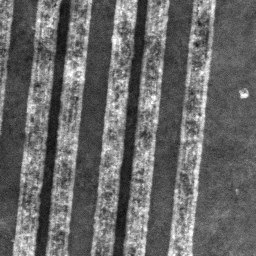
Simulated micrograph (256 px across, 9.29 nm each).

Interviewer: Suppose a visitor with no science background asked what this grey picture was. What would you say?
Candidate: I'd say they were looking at parallel lines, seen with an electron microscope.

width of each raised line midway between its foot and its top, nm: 169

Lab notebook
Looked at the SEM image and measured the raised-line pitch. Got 0.359 microns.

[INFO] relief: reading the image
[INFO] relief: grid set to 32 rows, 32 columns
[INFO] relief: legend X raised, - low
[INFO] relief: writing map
XX---XX--XX----XX--XX---XXX-----
X----XX--XX----XX--XX---XXX-----
X----XX--XX----XX--XX---XXX-----
X----XX--XX---XXX-XXX---XX------
X----XX--XX---XXX-XXX---XX------
X----XX--XX---XXX-XX----XX------
X---XXX-XXX---XXX-XX----XX------
X---XXX-XXX---XX--XX----XX------
X---XXX-XX----XX--XX----XX------
X---XX--XX----XX--XX----XX------
X---XX--XX----XX--XX---XXX------
----XX--XX----XX--XX---XXX------
----XX--XX----XX--XX---XXX------
----XX--XX---XXX-XXX---XX-------
----XX--XX---XXX-XXX---XX-------
----XX--XX---XX--XXX---XX-------
---XXX-XXX---XX--XX----XX-------
---XXX-XX----XX--XX----XX-------
---XXX-XX----XX--XX----XX-------
---XX--XX----XX--XX----XX-------
---XX--XX----XX--XX---XXX-------
---XX--XX----XX--XX---XXX-------
---XX--XX----XX--XX---XXX-------
---XX--XX---XXX-XXX---XXX-------
---XX--XX---XXX-XXX---XX--------
--XXX--XX---XXX-XX----XX--------
--XXX-XXX---XX--XX----XX--------
--XXX-XXX---XX--XX----XX--------
--XXX-XX----XX--XX----XX--------
--XX--XX----XX--XX----XX--------
--XX--XX----XX--XX---XXX--------
--XX--XX----XX--XX---XXX--------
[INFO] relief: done